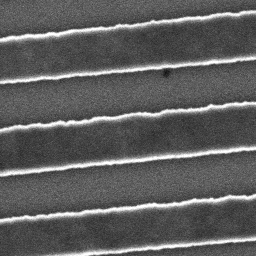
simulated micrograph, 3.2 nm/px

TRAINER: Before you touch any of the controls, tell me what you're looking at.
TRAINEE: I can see lines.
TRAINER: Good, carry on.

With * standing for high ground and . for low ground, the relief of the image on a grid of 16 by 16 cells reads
................
.........*******
****************
****************
*******.........
................
..............**
......**********
****************
**************..
****............
................
............****
...*************
****************
**********......